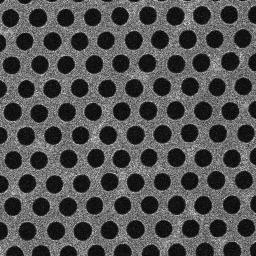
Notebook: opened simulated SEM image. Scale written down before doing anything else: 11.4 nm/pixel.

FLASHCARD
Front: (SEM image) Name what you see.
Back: a regular array of holes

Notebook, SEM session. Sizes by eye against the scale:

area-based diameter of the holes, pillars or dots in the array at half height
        17.4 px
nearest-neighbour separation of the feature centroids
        0.3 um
